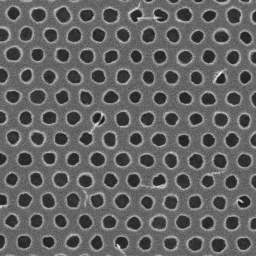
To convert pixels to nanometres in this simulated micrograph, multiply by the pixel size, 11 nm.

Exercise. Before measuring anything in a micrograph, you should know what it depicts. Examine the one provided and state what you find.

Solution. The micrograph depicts a regular array of holes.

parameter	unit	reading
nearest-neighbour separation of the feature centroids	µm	0.256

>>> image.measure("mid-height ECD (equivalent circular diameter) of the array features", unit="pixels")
13